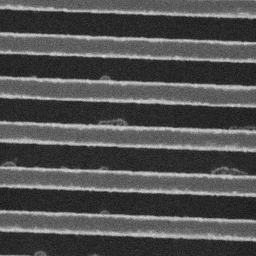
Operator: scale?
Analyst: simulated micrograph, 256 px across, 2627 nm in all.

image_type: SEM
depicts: lines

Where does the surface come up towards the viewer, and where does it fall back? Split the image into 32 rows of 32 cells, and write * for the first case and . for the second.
********************************
...........*********************
................................
................................
**********......................
********************************
********************************
.......................*********
................................
................................
************************........
********************************
.......*************************
................................
................................
*******.........................
********************************
********************************
.....................***********
................................
................................
****************................
********************************
.....***************************
...............................*
................................
***.............................
*******************************.
********************************
................****************
................................
................................